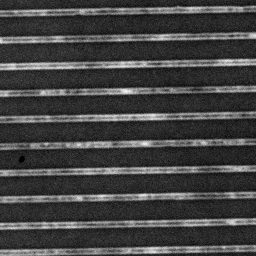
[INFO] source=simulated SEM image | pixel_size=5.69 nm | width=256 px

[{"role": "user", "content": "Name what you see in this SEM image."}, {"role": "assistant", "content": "parallel lines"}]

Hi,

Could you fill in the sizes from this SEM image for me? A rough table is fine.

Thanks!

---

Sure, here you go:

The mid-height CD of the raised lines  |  29.1 nm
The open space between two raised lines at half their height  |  119 nanometers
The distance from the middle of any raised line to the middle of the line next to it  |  151 nanometres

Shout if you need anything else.